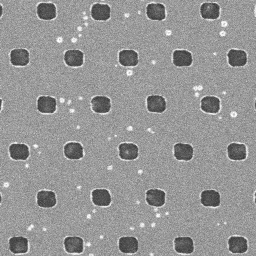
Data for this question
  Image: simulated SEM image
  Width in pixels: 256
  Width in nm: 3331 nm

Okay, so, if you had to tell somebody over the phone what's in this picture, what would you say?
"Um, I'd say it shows a regular array of holes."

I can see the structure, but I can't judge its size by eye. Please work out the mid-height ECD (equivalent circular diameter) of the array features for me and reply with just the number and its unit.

256 nm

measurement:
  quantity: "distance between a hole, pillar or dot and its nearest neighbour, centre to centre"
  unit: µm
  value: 0.696